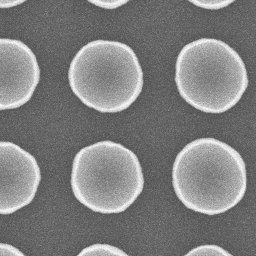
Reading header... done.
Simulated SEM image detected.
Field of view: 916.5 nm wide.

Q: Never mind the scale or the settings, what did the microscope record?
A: raised bodies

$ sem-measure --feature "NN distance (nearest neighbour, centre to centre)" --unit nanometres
363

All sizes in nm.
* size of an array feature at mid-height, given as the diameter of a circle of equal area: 250